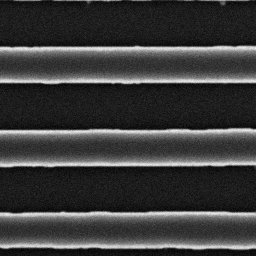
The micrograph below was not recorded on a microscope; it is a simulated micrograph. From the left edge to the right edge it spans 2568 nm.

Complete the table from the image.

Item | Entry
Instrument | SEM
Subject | lines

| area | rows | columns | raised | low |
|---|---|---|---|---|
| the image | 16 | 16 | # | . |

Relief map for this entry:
................
................
................
################
################
................
................
................
################
################
................
................
................
################
################
......###..#####